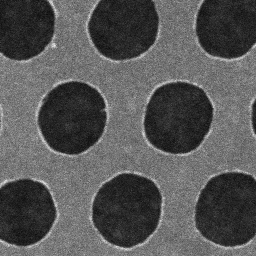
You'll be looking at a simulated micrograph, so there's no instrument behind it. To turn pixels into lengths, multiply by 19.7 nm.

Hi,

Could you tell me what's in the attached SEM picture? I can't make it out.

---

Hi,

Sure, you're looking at holes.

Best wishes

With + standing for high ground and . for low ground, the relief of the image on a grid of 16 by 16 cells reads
...+++....++....
...+++....++....
...+++....++....
..+++++..++++..+
++++++++++++++++
+++...++++..++++
+++....++....+++
++.....++....+++
+++...+++....+++
++++.+++++..++++
++++++++++++++++
...++++...+++...
...+++....++....
....++....++....
...+++....++....
++++++++++++++++